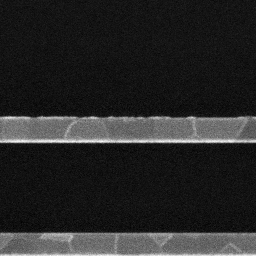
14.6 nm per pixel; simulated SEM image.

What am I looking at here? lines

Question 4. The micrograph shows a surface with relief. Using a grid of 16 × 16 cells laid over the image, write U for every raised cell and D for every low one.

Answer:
DDDDDDDDDDDDDDDD
DDDDDDDDDDDDDDDD
DDDDDDDDDDDDDDDD
DDDDDDDDDDDDDDDD
DDDDDDDDDDDDDDDD
DDDDDDDDDDDDDDDD
DDDDDDDDDDDDDDDD
UUUUUUUUUUUUUUUU
UUUUUUUUUUUUUUUU
DDDDDDDDDDDDDDDD
DDDDDDDDDDDDDDDD
DDDDDDDDDDDDDDDD
DDDDDDDDDDDDDDDD
DDDDDDDDDDDDDDDD
DDDDDDDDDDDDDDDD
UUUUUUUUUUUUUUUU